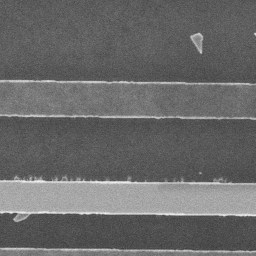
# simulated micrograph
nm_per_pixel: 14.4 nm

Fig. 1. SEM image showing lines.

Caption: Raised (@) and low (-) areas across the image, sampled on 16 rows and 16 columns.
----------------
----------------
----------------
----------------
----------------
@@@@@@@@@@@@@@@@
@@@@@@@@@@@@@@@@
----------------
----------------
----------------
----------------
@@@@@@@@@@@@@@@@
@@@@@@@@@@@@@@@@
----------------
----------------
----------------